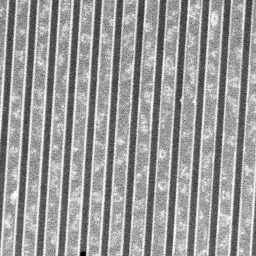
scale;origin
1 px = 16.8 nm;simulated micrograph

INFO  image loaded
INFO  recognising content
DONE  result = parallel lines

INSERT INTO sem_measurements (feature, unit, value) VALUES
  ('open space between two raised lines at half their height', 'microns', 0.145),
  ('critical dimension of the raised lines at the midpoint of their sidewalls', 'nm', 216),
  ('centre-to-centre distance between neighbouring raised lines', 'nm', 361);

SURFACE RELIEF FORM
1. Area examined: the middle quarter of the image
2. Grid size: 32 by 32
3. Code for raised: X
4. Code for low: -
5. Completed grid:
X--XXX---XXX--XXX---XXX--XXX--XX
X--XXX---XXX--XXX--XXXX--XXX--XX
X--XXX---XXX--XXX--XXX---XXX--XX
X--XXX---XXX--XXX--XXX---XXX--XX
X--XXX---XXX--XXX--XXX---XXX--XX
X--XXX--XXX---XXX--XXX---XXX--XX
X--XXX--XXX---XXX--XXX---XXX--XX
X--XXX--XXX---XXX--XXX--XXXX--XX
X--XXX--XXX---XXX--XXX--XXX---XX
---XXX--XXX---XXX--XXX--XXX---XX
---XXX--XXX---XXX--XXX--XXX---XX
---XXX--XXX--XXXX--XXX--XXX---XX
---XXX--XXX--XXX---XXX--XXX---XX
---XXX--XXX--XXX---XXX--XXX--XXX
---XXX--XXX--XXX---XXX--XXX--XXX
--XXX---XXX--XXX---XXX--XXX--XXX
--XXX---XXX--XXX---XXX--XXX--XXX
--XXX---XXX--XXX--XXXX--XXX--XXX
--XXX---XXX--XXX--XXX---XXX--XXX
--XXX---XXX--XXX--XXX---XXX--XXX
--XXX---XXX--XXX--XXX---XXX--XXX
--XXX--XXX---XXX--XXX---XXX--XXX
--XXX--XXX---XXX--XXX---XXX--XXX
--XXX--XXX---XXX--XXX--XXXX--XXX
--XXX--XXX---XXX--XXX--XXX---XXX
--XXX--XXX---XXX--XXX--XXX---XXX
--XXX--XXX---XXX--XXX--XXX---XXX
--XXX--XXX--XXXX--XXX--XXX---XXX
--XXX--XXX--XXX---XXX--XXX---XXX
--XXX--XXX--XXX---XXX--XXX--XXXX
--XXX--XXX--XXX---XXX--XXX--XXX-
-XXX---XXX--XXX---XXX--XXX--XXX-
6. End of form